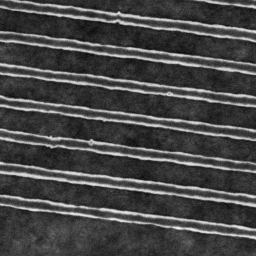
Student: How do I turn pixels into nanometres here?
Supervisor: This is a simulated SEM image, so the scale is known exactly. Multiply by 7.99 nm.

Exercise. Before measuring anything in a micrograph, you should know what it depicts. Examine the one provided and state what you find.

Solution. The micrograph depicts parallel lines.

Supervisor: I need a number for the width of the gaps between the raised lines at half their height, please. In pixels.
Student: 23.3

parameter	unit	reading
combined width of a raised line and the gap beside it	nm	261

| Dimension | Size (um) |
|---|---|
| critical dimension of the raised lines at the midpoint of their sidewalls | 0.0753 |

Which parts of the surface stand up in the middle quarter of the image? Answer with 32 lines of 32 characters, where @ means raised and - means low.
--------------------------------
--------------------------------
@@@-----------------------------
@@@@@@@@@@@---------------------
--@@@@@@@@@@@@@@@@--------------
---------@@@@@@@@@@@@@@-@-------
----------------@@@@@@@@@@@@@@@@
-------------------------@@@@@@@
--------------------------------
--------------------------------
@-------------------------------
@@@@@@@@------------------------
@@@@@@@@@@@@@@@@----------------
------@@@@@@@@@@@@@@@@@---------
----------------@@@@@@@@@@@@@@@@
-----------------------@@@@@@@@@
------------------------------@@
--------------------------------
--------------------------------
@@@@@@@-------------------------
@@@@@@@@@@@@@@@-----------------
------@@@@@@@@@@@@@@@-----------
-------------@@@@@@@@@@@@@@@@@--
-------------------@@@@@@@@@@@@@
----------------------------@@@@
--------------------------------
--------------------------------
@@@@----------------------------
@@@@@@@@@@@@--------------------
--@@@@@@@@@@@@@@@@@@------------
----------@@@@@@@@@@@@@@@@@@----
------------------@@@@@@@@@@@@@@